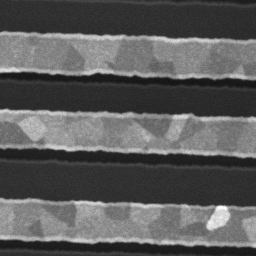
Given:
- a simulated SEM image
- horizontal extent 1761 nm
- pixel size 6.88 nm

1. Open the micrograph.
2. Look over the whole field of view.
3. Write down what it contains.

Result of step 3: lines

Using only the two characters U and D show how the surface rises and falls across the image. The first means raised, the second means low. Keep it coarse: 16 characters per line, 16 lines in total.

DDDDDDDDDDDDDDDD
DDDDDDDDDDDDDDDD
UUUUUUUUUUUUUUUD
UUUUUUUUUUUUUUUU
UDUUUUUUUUUUUUUU
DDDDDDDDDDDDDDDD
DDDDDDDDDDDDDDDD
UUUUUUUUUUUUUUUU
UUUUUUUUUUUUUUUU
DDDDDDDUUUUUUUUU
DDDDDDDDDDDDDDDD
DDDDDDDDDDDDDDDD
UUUDDDDDDDDDDDDD
UUUUUUUUUUUUUUUU
UUUUUUUUUUUUUUUU
DDDDDDDDDDDDDDDD